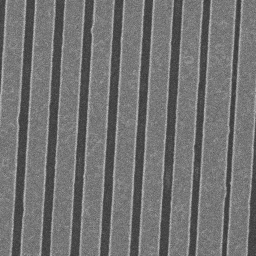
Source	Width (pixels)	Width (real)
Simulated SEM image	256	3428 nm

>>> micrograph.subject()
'parallel lines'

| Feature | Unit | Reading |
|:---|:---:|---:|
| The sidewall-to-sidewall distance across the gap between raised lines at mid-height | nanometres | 134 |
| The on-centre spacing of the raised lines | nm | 395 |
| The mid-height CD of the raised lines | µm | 0.256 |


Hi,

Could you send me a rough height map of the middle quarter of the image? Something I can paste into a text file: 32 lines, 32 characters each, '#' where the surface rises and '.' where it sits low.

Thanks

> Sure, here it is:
####...####...#####...####...###
####...####...#####...####...###
####...####...#####...####...###
####...####...#####..#####...###
####...####...#####..#####...###
####...####...#####..#####...###
####...####...#####..#####...###
####..#####...#####..#####..####
####..#####...####...#####..####
####..#####...####...#####..####
####..#####...####...#####..####
####..#####...####...#####..####
###...#####..#####...####...####
###...#####..#####...####...####
###...#####..#####...#####..####
###...#####..#####...####...####
###...####...#####...####...####
###...#####..#####...####...####
###...####...#####...####...####
###...####...#####...####...####
###...####...#####..#####...####
###...####...#####..#####...####
###...####...#####..#####...####
###...####...#####..#####...####
###..#####...#####..#####...####
###..#####...####...#####..#####
###..#####...####...#####..#####
###..#####...####...#####..#####
###..#####...####...#####..#####
##...#####...####...#####..#####
##...#####...####...####...#####
##...#####...####...#####..#####